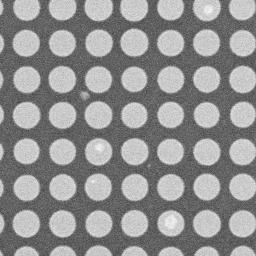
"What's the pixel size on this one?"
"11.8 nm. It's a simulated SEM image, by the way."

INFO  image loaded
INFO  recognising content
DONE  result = an array of small figures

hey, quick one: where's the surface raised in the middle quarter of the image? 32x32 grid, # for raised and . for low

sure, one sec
................................
##.....####.....###......####...
##....######...#####....######..
###...######...#####....######..
###...######...#####....######..
##....######...#####....#####...
##.....####.....###......####...
................................
................................
................................
##....#####.....####.....####...
###...######...######...#####...
###..#######...######...######..
###..#######...######...######..
##....######...#####....#####...
#......###......###......###....
................................
................................
................................
#......####.....####.....####...
###...######...######...#####...
###..#######...######...######..
###..#######...######...######..
###...######...######...#####...
#......####.....####.....###....
................................
................................
................................
##....#####.....####....#####...
###...######...######...######..
###..#######...######...######..
###..#######...######...######..